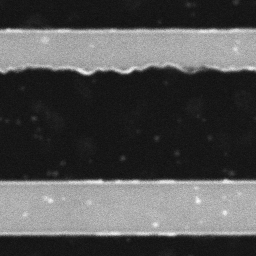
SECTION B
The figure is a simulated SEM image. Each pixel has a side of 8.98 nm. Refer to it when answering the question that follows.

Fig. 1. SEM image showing one or a few lines or trenches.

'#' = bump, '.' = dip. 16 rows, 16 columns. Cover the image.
################
################
................
................
################
################
################
################
################
################
################
................
................
................
................
################